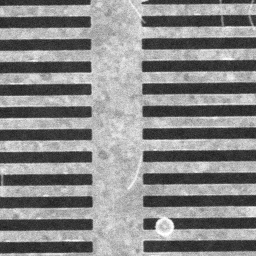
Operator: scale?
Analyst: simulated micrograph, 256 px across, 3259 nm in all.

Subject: groups of lines, slits or small figures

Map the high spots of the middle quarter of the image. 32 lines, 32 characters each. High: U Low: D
DDDDDDDUUUUUUUUUUUUDDDDDDDDDDDDD
DDDDDDDUUUUUUUUUUUUDDDDDDDDDDDDD
UUUUUUUUUUUUUUUUUUUUUUUUUUUUUUUU
UUUUUUUUUUUUUUUUUUUUUUUUUUUUUUUU
UUUUUUUUUUUUUUUUUUUUUUUUUUUUUUUD
DDDDDDDUUUUUUUUUUUUDDDDDDDDDDDDD
DDDDDDDUUUUUUUUUUUUDDDDDDDDDDDDD
DDDDDDDUUUUUUUUUUUUUDDDDDDDDDDDD
UUUUUUUUUUUUUUUUUUUUUUUUUUUUUUUU
UUUUUUUUUUUUUUUUUUUUUUUUUUUUUUUU
DDDDDDDUUUUUUUUUUUUUDDDDDDDDDDDD
DDDDDDDUUUUUUUUUUUUDDDDDDDDDDDDD
DDDDDDDUUUUUUUUUUUUDDDDDDDDDDDDD
DDDDDDDUUUUUUUUUUUUUDDDDDDUUUDDD
UUUUUUUUUUUUUUUUUUUUUUUUUUUUUUUU
UUUUUUUUUUUUUUUUUUUUUUUUUUUUUUUU
DDDDDDDUUUUUUUUUUUUDDDDDDDDDDDDD
DDDDDDDUUUUUUUUUUUUDDDDDDDDDDDDD
DDDDDDDUUUUUUUUUUUUDDDDDDDDDDDDD
UUUUUUUUUUUUUUUUUUUUUUUUUUUUUUUU
UUUUUUUUUUUUUUUUUUUUUUUUUUUUUUUU
UUUUUUUUUUUUUUUUUUUUDDDDDDDDDDDD
DDDDDDDUUUUUUUUUUUUDDDDDDDDDDDDD
DDDDDDDUUUUUUUUUUUUDDDDDDDDDDDDD
DDDDDDDUUUUUUUUUUUUUDDDDDDDDDDDD
UUUUUUUUUUUUUUUUUUUUUUUUUUUUUUUU
UUUUUUUUUUUUUUUUUUUUUUUUUUUUUUUU
DDDDDDDUUUUUUUUUUUUUDDDDDDDDDDDD
DDDDDDDUUUUUUUUUUUUDDDDDDDDDDDDD
DDDDDDDUUUUUUUUUUUUDDDDDDDDDDDDD
DDDDDDDUUUUUUUUUUUUUUUUUUUUUUUUU
UUUUUUUUUUUUUUUUUUUUUUUUUUUUUUUU